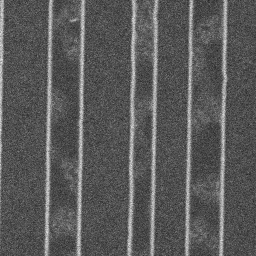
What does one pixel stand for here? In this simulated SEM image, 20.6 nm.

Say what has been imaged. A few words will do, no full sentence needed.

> one or a few lines or trenches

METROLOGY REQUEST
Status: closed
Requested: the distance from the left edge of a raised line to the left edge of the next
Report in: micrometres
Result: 1.45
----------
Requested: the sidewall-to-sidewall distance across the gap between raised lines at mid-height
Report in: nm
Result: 984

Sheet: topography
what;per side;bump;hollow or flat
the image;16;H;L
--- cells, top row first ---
LLLHHLLLHHLLHHLL
LLLHHLLLHHLLHHLL
LLLHHLLLHHLLHHLL
LLLHHLLLHHLLHHLL
LLLHHLLLHHLLHHLL
LLLHHLLLHHLLHHLL
LLLHHLLLHHLLHHLL
LLLHHLLLHHLLHHLL
LLLHHLLLHHLLHHLL
LLLHHLLLHHLLHHLL
LLLHHLLLHHLLHHLL
LLLHHLLLHHLLHHLL
LLLHHLLLHHLLHHLL
LLLHHLLLHHLLHHLL
LLLHHLLLHHLLHHLL
LLLHHLLLHHLLHHLL